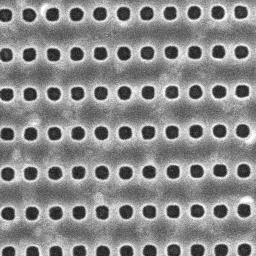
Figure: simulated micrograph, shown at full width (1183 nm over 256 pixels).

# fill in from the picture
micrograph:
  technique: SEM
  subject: a regular array of holes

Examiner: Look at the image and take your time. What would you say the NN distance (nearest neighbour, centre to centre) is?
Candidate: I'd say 108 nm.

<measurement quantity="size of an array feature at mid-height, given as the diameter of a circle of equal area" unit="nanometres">69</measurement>